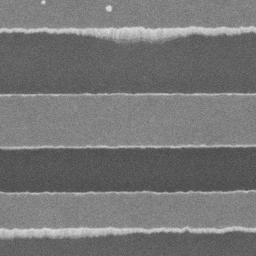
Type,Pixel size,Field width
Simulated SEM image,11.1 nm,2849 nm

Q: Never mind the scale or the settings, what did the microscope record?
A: lines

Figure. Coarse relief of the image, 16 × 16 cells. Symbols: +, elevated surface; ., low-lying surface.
++++++++++++++++
++++++++++++++++
................
................
................
................
++++++++++++++++
++++++++++++++++
++++++++++++++++
................
................
................
++++++++++++++++
++++++++++++++++
................
................